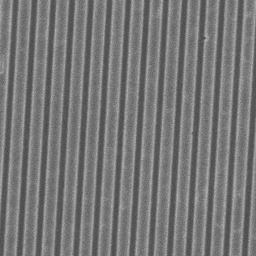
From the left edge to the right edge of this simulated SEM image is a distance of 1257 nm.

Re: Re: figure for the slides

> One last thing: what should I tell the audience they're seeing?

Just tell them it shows parallel lines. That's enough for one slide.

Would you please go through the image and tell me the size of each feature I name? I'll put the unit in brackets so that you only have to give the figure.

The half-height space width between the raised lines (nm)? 33.1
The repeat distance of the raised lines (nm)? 91.9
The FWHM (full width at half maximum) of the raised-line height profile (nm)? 61.8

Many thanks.